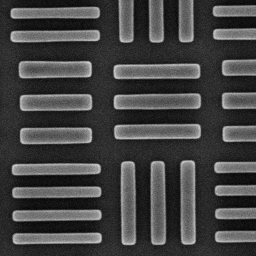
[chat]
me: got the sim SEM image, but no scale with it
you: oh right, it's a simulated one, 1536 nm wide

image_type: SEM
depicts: groups of lines, slits or small figures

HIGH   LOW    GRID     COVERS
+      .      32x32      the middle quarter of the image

+++++++.......++++++++++++++++++
+++++++......+++++++++++++++++++
+++++++......+++++++++++++++++++
.............++.................
................................
................................
................................
................................
+++++++......+++++++++++++++++++
+++++++......+++++++++++++++++++
+++++++......+++++++++++++++++++
+++.............................
................................
................................
................................
.............+++++++++++++++++++
++++++.......+++++++++++++++++++
+++++++......+++++++++++++++++++
+++++++.......+++...............
++++++..........................
................................
................................
................................
................................
.......................+......++
+++++++++.....++++....+++....+++
+++++++++.....++++....+++....+++
++++++........++++....+++....+++
..............++++....+++....+++
..............++++....+++....+++
..............++++....+++....+++
+++++++++.....++++....+++....+++